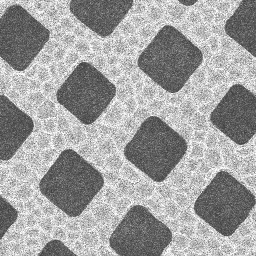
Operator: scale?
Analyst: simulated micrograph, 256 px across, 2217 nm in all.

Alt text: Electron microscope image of holes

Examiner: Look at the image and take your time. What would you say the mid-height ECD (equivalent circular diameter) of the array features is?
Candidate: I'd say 505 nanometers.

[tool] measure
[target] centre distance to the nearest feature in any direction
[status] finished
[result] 778 nm